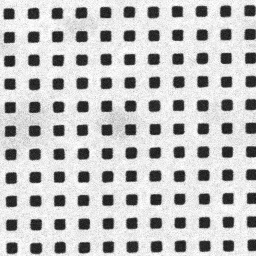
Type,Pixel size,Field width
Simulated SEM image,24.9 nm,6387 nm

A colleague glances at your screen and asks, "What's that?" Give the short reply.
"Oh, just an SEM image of a regular array of holes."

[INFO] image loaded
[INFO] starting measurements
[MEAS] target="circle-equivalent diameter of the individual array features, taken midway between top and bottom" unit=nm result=317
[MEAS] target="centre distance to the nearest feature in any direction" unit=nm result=582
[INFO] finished